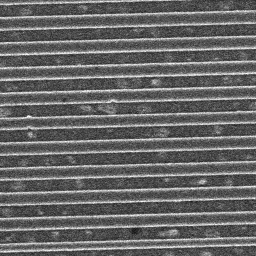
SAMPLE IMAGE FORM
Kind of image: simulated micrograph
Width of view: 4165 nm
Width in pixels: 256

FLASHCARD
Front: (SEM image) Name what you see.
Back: parallel lines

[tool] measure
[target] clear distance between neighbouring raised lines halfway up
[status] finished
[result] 12.7 px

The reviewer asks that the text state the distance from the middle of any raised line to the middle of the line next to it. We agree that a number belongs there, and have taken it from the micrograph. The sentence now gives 0.405 um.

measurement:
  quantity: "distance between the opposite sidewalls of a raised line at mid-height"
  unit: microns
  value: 0.205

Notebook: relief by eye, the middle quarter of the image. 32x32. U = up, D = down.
DDDDDDUUUUUUUUUUUUUUUUUUUUUUUUUU
UUUUUUUUUUUUUUUUUUUUUUUUUUUUUUUU
UUUUUUUUUUUUUUUUUUUUUUUUUUUUUUUU
UUUUDDDDDDDDDDDDDDDDDDDDDDDDDDDD
DDDDDDDDDDDDDDDDDDDDDDDDDDDDDDDD
DDDDDDDDDDDDDDDDDDDDDDDDDDDDDDDD
DDDDDDDDDDDDDDUDDDDUUUUUUUUUUUUU
UUUUUUUUUUUUUUUUUUUUUUUUUUUUUUUU
UUUUUUUUUUUUUUUUUUUUUUUUUUUUUUUU
UUUUUUUUUDUDDDDUUDDDDDDDDDDDDDDD
DDDDDDDDDDDDDDDDDDDDDDDDDDDDDDDD
DDDDDDDDDDDDDDDDDDDDDDDDDDDDDDDD
DDDDDDDDDDDDDDDDDDDDDDDDUUUUUUUU
UUUUUUUUUUUUUUUUUUUUUUUUUUUUUUUU
UUUUUUUUUUUUUUUUUUUUUUUUUUUUUUUU
UUUUUUUUUUUUUDDDDDDDDDDDDDDDDDDD
DDDDDDDDDDDDDDDDDDDDDDDDDDDDDDDD
DDDDDDDDDDDDDDDDDDDDDDDDDDDDDDDD
DDDDDDDDDDDDDDDDDDDDDDDDDDDDDDDD
UUUUUUUUUUUUUUUUUUUUUUUUUUUUUUUU
UUUUUUUUUUUUUUUUUUUUUUUUUUUUUUUU
UUUUUUUUUUUUUUUUUUUUUUUUUUUDDDDU
DDDDDDDDDDDDDDDDDDDDDDDDDDDDDDDD
DDDDDDDDDDDDDDDDDDDDDDDDDDDDDDDD
DDDDDDDDDDDDDDDDDDDDDDDDDDDDDDDD
DDDDDUUUUUUUUUUUUUUUUUUUUUUUUUUU
UUUUUUUUUUUUUUUUUUUUUUUUUUUUUUUU
UUUUUUUUUUUUUUUUUUUUUUUUUUUUUUUU
UUUDDDDDDDDDDDDDDDDDDDDDDDDDDDDD
DDDDDDDDDDDDDDDDDDDDDDDDDDDDDDDD
DDDDDDDDDDDDDDDDDDDDDDDDDDDDDDDD
DDDDDDDDDDDDDDDDDDUUUUUUUUUUUUUU